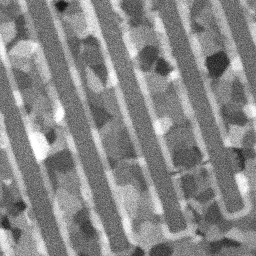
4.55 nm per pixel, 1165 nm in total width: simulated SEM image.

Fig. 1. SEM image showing parallel lines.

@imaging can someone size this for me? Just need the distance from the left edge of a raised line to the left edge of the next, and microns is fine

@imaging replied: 0.279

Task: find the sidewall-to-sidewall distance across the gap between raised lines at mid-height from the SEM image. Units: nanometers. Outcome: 107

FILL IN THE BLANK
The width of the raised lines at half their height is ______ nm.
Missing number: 171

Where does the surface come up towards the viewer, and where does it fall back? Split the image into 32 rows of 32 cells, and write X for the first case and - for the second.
XXX---XXXXX---XXXXX---XXXXX---XX
XXX----XXXX----XXXX----XXXXX---X
XXXX---XXXXX----XXXX---XXXXX---X
XXXX---XXXXX----XXXX---XXXXX---X
XXXX----XXXX----XXXX----XXXXX---
XXXXX---XXXXX---XXXXX---XXXXX---
XXXXX---XXXXX---XXXXX---XXXXX---
-XXXX----XXXXX---XXXXX---XXXXX--
-XXXXX---XXXXX---XXXXX---XXXXX--
-XXXXX---XXXXX---XXXXX---XXXXX--
--XXXX----XXXXX---XXXXX---XXXXX-
--XXXXX---XXXXX---XXXXX---XXXXX-
--XXXXX---XXXXX---XXXXX----XXXX-
---XXXX----XXXX----XXXXX---XXXXX
---XXXXX---XXXXX---XXXXX---XXXXX
---XXXXX---XXXXX---XXXXX---XXXXX
----XXXXX---XXXXX---XXXXX---XXXX
X---XXXXX---XXXXX---XXXXX---XXXX
X---XXXXX---XXXXX---XXXXX---XXXX
X----XXXX----XXXXX---XXXXX---XXX
XX---XXXXX---XXXXX---XXXXX---XXX
XX---XXXXX---XXXXX----XXXX----XX
XX----XXXX----XXXXX---XXXXX---XX
XXX---XXXXX---XXXXX---XXXXX---XX
XXX---XXXXX---XXXXX---XXXXX----X
XXXX---XXXX----XXXXX---XXXXX---X
XXXX---XXXXX---XXXXX---XXXXX--XX
XXXX---XXXXX----XXXX---XXXXXXXXX
XXXXX---XXXXX---XXXXX---XXXXXXXX
XXXXX---XXXXX---XXXXX-XXXXXXXXXX
XXXXX---XXXXX----XXXXXXXXXXXXXXX
-XXXXX---XXXXX--XXXXXXXXXXXXXXXX